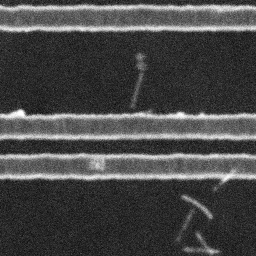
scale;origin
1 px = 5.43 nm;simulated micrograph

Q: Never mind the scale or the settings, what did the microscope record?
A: lines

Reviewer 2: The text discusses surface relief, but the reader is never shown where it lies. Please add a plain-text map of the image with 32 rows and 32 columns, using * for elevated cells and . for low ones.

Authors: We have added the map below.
................................
********************************
********************************
********************************
................................
................................
................................
................................
................................
................................
................................
................................
................................
................................
***.****************************
********************************
********************************
................................
................................
.******************..***********
********************************
********************************
................................
................................
................................
................................
................................
................................
................................
................................
................................
................................